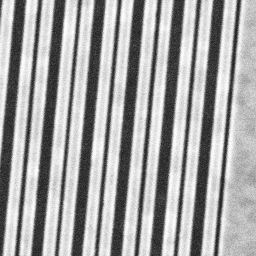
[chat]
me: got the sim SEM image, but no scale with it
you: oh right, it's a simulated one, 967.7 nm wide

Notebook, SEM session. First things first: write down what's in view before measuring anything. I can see parallel lines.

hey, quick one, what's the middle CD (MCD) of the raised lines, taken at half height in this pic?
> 33.9 nanometers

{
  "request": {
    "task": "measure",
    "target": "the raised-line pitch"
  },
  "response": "0.0749 micrometres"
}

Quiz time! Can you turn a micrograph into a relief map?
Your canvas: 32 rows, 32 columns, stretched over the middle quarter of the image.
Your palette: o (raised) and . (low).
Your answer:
oo.ooo...oo..oo....oo..oo....oo.
o..oo....oo..oo....oo..oo....oo.
o..oo....oo..oo....oo..oo....oo.
o..oo....oo..oo....oo..oo....oo.
o..oo....oo..oo....oo..oo....oo.
o..oo....oo..oo....oo..oo....oo.
o..oo....oo..oo....oo..oo....oo.
o..oo....oo..oo....oo..oo....oo.
o..oo....oo..oo....oo..oo...ooo.
o.ooo....oo..oo...ooo..oo...oo..
o..oo...ooo.ooo...oo..oo....oo..
..ooo...oo..oo....oo..oo....oo..
..oo....oo..oo....oo..oo....oo..
..oo....oo..oo....oo..oo....oo..
..oo....oo..oo....oo..oo....oo..
..oo....oo..oo....oo..oo....oo..
..oo....oo..oo....oo..oo....oo..
..oo....oo..oo....oo..oo....oo..
..oo....oo..oo....oo..oo....oo..
..oo....oo..oo....oo..oo...ooo..
.ooo....oo..oo...ooo.ooo...oo..o
.ooo...ooo.ooo...oo..oo....oo..o
.ooo...oo..oo....oo..oo....oo..o
.oo....oo..oo....oo..oo....oo..o
.oo....oo..oo....oo..oo....oo..o
.oo....oo..oo....oo..oo....oo..o
.oo....oo..oo....oo..oo....oo..o
.oo....oo..oo....oo..oo....oo..o
.oo....oo..oo....oo..oo....oo..o
.oo....oo..oo....oo..oo....oo..o
.oo....oo..oo....oo..oo...ooo..o
.oo....oo..oo...ooo.ooo...oo..oo